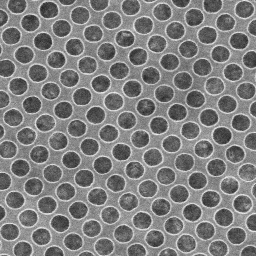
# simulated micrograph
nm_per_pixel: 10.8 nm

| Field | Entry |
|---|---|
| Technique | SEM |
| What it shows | a regular array of holes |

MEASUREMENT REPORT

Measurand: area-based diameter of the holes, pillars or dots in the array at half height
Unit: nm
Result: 192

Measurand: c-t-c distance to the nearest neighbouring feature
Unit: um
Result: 0.24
